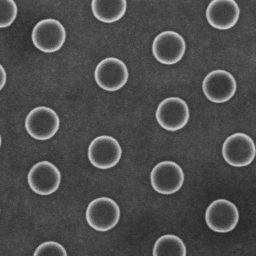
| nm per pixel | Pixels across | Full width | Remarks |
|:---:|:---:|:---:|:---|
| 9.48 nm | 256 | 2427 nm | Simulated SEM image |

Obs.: a regular array of raised bodies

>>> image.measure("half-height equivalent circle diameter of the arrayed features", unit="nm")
303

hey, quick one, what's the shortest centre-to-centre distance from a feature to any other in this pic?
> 0.594 microns